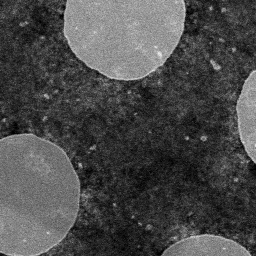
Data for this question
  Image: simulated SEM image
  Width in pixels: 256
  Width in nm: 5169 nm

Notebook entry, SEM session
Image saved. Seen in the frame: raised bodies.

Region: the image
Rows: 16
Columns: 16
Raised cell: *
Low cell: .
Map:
....********....
....*******.....
....*******.....
.....******.....
......***.......
...............*
...............*
...............*
.*.............*
****...........*
*****...........
*****...........
*****...........
*****...........
****............
***........****.